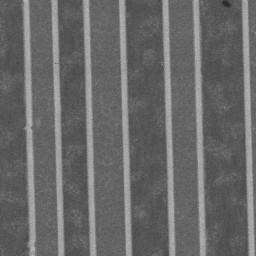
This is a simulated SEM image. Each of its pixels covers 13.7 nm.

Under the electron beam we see one or a few lines or trenches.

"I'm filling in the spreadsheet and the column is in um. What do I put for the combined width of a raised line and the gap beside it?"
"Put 0.963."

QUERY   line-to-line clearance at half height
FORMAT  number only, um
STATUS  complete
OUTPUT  0.596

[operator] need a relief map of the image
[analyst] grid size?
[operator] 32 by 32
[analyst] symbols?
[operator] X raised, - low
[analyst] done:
---XXXX----XXXX------XXX-------X
---XXXX----XXXX------XXX-------X
---XXXX----XXXX------XXX-------X
---XXXX----XXXX------XXX-------X
---XXXX----XXXX------XXXX------X
---XXXX----XXXX------XXXX------X
----XXX----XXXX------XXXX------X
----XXX----XXXX------XXXX------X
----XXX----XXXX------XXXX------X
----XXX----XXXX------XXXX------X
----XXX----XXXX------XXXX------X
----XXX----XXXXX-----XXXX------X
----XXX----XXXXX-----XXXX------X
----XXX----XXXXX-----XXXX------X
----XXX----XXXXX-----XXXX------X
----XXX----XXXXX-----XXXX------X
----XXX----XXXXX-----XXXX------X
----XXX----XXXXX-----XXXX------X
----XXX----XXXXX-----XXXX------X
----XXX----XXXXX-----XXXX------X
----XXX----XXXXX-----XXXX------X
----XXX----XXXXX-----XXXX------X
----XXX----XXXXX-----XXXX------X
----XXX----XXXXX-----XXXX------X
----XXX-----XXXX-----XXXX------X
----XXX-----XXXX-----XXXX------X
----XXX-----XXXX-----XXXX------X
----XXXX----XXXX-----XXXX------X
----XXXX----XXXX------XXX------X
----XXXX----XXXX------XXX------X
----XXXX----XXXX------XXX------X
----XXXX----XXXX------XXX-------